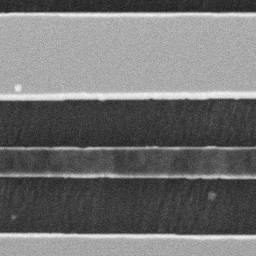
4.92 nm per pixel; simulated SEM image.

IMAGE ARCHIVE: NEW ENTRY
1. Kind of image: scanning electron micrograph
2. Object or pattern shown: lines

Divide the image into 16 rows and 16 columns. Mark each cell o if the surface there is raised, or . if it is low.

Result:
................
oooooooooooooooo
oooooooooooooooo
oooooooooooooooo
oooooooooooooooo
oooooooooooooooo
................
................
................
oooooooooooooooo
oooooooooooooooo
................
................
................
................
oooooooooooooooo